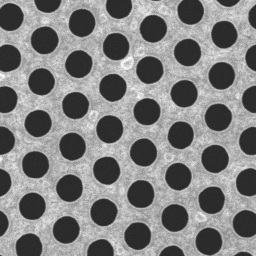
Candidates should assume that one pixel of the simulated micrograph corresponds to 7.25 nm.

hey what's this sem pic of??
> a regular array of holes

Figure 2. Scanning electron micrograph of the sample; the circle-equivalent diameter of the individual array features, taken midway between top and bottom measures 198 nm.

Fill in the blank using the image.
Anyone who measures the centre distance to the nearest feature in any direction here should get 298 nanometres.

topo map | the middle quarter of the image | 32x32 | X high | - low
-------XXXXXXXXXXX-------XXXXX--
-------XXXXXXXXXXX-------XXXXXXX
X-----XXXXX--XXXXX-------XXXXXXX
XXX-XXXXXX-----XXXX-----XXXXXXXX
XXXXXXXXX------XXXXX---XXXXX----
XXXXXXXXX-------XXXXXXXXXXX-----
XXXXXXXXX-------XXXXXXXXXXX-----
X----XXXX------XXXXXXXXXXXX-----
------XXXX-----XXXXXXXXXXXX-----
------XXXXXXXXXXXX-----XXXX-----
------XXXXXXXXXXXX------XXXX----
------XXXXXXXXXXX-------XXXXXXXX
-----XXXXXXXXXXXX-------XXXXXXXX
XX--XXXXX----XXXXX------XXXXXXXX
XXXXXXXXX-----XXXX-----XXXXX--XX
XXXXXXXX-------XXXXXXXXXXXX-----
XXXXXXXX-------XXXXXXXXXXX------
X---XXXX-------XXXXXXXXXXX------
-----XXXX-----XXXXXXXXXXXX------
-----XXXXX---XXXXX----XXXX------
-----XXXXXXXXXXXX------XXXX----X
-----XXXXXXXXXXX-------XXXXXXXXX
-----XXXXXXXXXXX-------XXXXXXXXX
----XXXXX---XXXXX------XXXXXXXXX
XXXXXXXX-----XXXX-----XXXXXXXXXX
XXXXXXX-------XXXXX--XXXXX-----X
XXXXXXX-------XXXXXXXXXXXX------
XXXXXXX-------XXXXXXXXXXX-------
----XXXX------XXXXXXXXXXX-------
-----XXXX----XXXXX---XXXXX------
-----XXXXXXXXXXX------XXXX-----X
-----XXXXXXXXXXX------XXXXXX-XXX